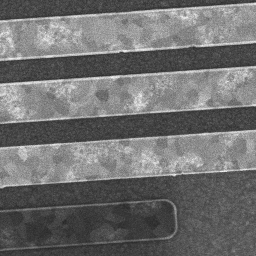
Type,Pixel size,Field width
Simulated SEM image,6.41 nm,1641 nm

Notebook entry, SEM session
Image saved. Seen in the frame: parallel lines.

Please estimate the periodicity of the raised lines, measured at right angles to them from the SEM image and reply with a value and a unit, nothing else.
406 nanometres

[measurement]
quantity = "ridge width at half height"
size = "0.252 microns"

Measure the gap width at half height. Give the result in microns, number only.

0.153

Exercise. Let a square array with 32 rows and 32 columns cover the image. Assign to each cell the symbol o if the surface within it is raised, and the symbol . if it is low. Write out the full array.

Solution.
...............................o
.................ooooooooooooooo
..oooooooooooooooooooooooooooooo
oooooooooooooooooooooooooooooooo
oooooooooooooooooooooooooooooooo
ooooooooooooooooooooooooooooo...
ooooooooooooooo.................
................................
..............................oo
................oooooooooooooooo
.ooooooooooooooooooooooooooooooo
oooooooooooooooooooooooooooooooo
oooooooooooooooooooooooooooooooo
ooooooooooooooooooooooooooo.....
ooooooooooooo...................
................................
.............................ooo
..............oooooooooooooooooo
oooooooooooooooooooooooooooooooo
oooooooooooooooooooooooooooooooo
oooooooooooooooooooooooooooooooo
ooooooooooooooooooooooooooo.....
oooooooooooo....................
................................
................................
.............ooooooooo..........
oooooooooooooooooooooo..........
oooooooooooooooooooooo..........
oooooooooooooooooooooo..........
ooooooooooooooooooooo...........
ooooooooooo.....................
................................